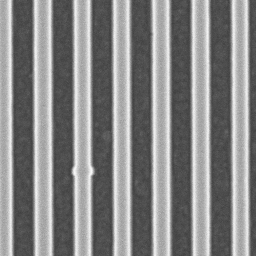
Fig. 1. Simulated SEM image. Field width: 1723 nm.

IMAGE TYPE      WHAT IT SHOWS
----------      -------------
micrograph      parallel lines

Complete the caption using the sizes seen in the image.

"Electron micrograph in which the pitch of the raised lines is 266 nm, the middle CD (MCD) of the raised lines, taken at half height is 119 nanometres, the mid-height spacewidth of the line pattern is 146 nm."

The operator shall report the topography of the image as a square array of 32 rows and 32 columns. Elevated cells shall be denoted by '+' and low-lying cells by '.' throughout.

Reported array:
+...++...++...++...++...++...++.
+...++...++...++...++...++...++.
+...++...++...++...++...++...++.
+...++...++...++...++...++...++.
+...++...++...++...++...++...++.
+...++...++...++...++...++...++.
+...++...++...++...++...++...++.
+...++...++...++...++...++...++.
+...++...++...++...++...++...++.
+...++...++...++...++...++...++.
+...+++..++...++...++...++...++.
+...+++..++...++...++...++...++.
+...+++..++...++...++...++...++.
+...+++..++...++...++...++...++.
+...+++..++...++...++...++...++.
+...+++..++...++...++...++...++.
+...+++..++...++...++...++...++.
+...+++..++...++...++...++...++.
+...+++..++...++...++...++...++.
+...+++..++...++...++...++...++.
+...+++..++...++...++...++...++.
++..+++..+++..++...++...++...++.
++..+++..++...++...++...++...++.
++..+++..++...++...++...++...++.
++..+++..++...++...++...++...++.
++..+++..++...++...++...++...++.
++..+++..++...++...++...++...++.
++..+++..++...++...++...++...++.
++..+++..++...++...++...++...++.
++..+++..++...++...++...++...++.
++..+++..++...++...++...++...++.
++..+++..++...++...++...++...++.